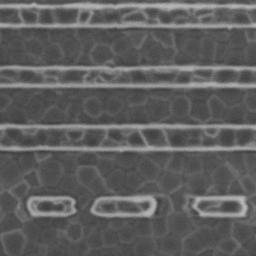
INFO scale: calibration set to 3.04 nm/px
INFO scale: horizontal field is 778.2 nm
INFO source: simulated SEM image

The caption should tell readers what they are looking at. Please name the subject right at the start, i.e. one or a few lines or trenches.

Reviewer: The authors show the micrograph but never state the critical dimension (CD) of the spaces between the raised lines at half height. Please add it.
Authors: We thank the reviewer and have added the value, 0.122 µm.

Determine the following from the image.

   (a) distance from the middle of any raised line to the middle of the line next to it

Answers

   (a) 190 nanometers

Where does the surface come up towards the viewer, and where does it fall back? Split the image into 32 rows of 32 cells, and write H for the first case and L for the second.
LLLLLLLLLLLLLLLLLLLLLLLLLLLLLLLL
HHHHHHHHHHHHHHHHHHHHHHHHHHHHHHHH
HHHHHHHHHHHHHHHHHHHHHHHHHHHHHHHH
LLLLLLLLLLLLLLLLLLLLLLLLLLLLLLLL
LLLLLLLLLLLLLLLLLLLLLLLLLLLLLLLL
LLLLLLLLLLLLLLLLLLLLLLLLLLLLLLLL
LLLLLLLLLLLLLLLLLLLLLLLLLLLLLLLL
LLLLLLLLLLLLLLLLLLLLLLLLLLLLLLLL
HHHLLLLLLLLLLLLLLLHHHHHHHHHHHHLL
HHHHHHHHHHHHHHHHHHHHHHHHHHHHHHHH
HHHHHHHHHHHHHHHHHHHHHHHHHHHHHHHH
LLLLLLLLLLLLLLLLLLLLLLLLLLLLLLLL
LLLLLLLLLLLLLLLLLLLLLLLLLLLLLLLL
LLLLLLLLLLLLLLLLLLLLLLLLLLLLLLLL
LLLLLLLLLLLLLLLLLLLLLLLLLLLLLLLL
LLLLLLLLLLLLLLLLLLLLLLLLLLLLLLLL
HHHHHHHHHHHHHHHHHHHHHHHHHHHHHHHH
HHHHHHHHHHHHHHHHHHHHHHHHHHHHHHHH
HHHHHHHHHHHHHHHHHHHHHHHHHHHHHHHH
LLLLLLLLLLLLLLLLLLLLLLLLLLLLLLLL
LLLLLLLLLLLLLLLLLLLLLLLLLLLLLLLL
LLLLLLLLLLLLLLLLLLLLLLLLLLLLLLLL
LLLLLLLLLLLLLLLLLLLLLLLLLLLLLLLL
LLLLLLLLLLLLLLLLLLLLLLLLLLLLLLLL
LLLLLLLLLLLLLLLLLLLLLLLLLLLLLLLL
LLLLHHHHHLLLHHHHHHHLLLLLHHHHHHLL
LLLLHHHHHLLLHHHHHHHLLLLLLHHHHHLL
LLLLLLLLLLLLLLLLLLLLLLLLLLLLLLLL
LLLLLLLLLLLLLLLLLLLLLLLLLLLLLLLL
LLLLLLLLLLLLLLLLLLLLLLLLLLLLLLLL
LLLLLLLLLLLLLLLLLLLLLLLLLLLLLLLL
LLLLLLLLLLLLLLLLLLLLLLLLLLLLLLLL